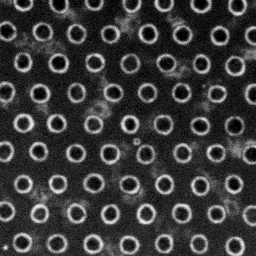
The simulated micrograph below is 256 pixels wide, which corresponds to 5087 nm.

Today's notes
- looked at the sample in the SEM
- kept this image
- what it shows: a regular array of raised bodies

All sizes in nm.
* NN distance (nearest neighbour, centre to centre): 668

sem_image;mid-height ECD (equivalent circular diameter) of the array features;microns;0.348